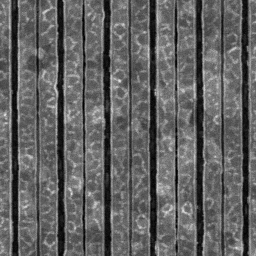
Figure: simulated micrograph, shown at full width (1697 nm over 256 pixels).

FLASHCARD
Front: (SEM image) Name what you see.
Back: parallel lines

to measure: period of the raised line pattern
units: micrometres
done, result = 0.151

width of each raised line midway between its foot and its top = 114 nm